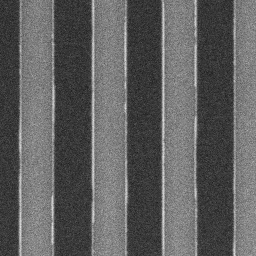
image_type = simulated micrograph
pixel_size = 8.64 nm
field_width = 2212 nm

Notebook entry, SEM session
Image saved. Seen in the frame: lines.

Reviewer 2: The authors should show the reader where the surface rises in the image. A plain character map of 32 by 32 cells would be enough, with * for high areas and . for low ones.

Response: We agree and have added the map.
***....*****....****....*****...
***....*****....****.....****...
***....*****....****.....****...
***....*****....****.....****...
***....*****....****.....****...
***....*****....****....*****...
***....*****....****....*****...
***....*****....****....*****...
***....*****....****....*****...
***....*****....****....*****...
***....*****....****....*****...
***....*****....****.....****...
***....*****....****.....****...
***....*****....****.....****...
***....*****....****....*****...
***....*****....****....*****...
***....*****....****....*****...
***....*****....****....*****...
***....*****....****....*****...
***....*****....****....*****...
***....*****....****....*****...
***....*****....****....*****...
***....*****....****....*****...
***....*****....****....*****...
***....*****....****....*****...
***....*****....****.....****...
***....*****....****.....****...
***....*****....****.....****...
***....*****....****.....****...
***....*****....****.....****...
***....*****....****.....****...
***....*****....****.....****...